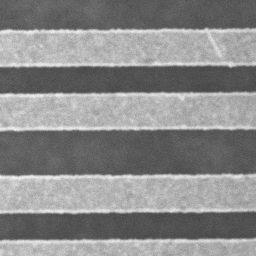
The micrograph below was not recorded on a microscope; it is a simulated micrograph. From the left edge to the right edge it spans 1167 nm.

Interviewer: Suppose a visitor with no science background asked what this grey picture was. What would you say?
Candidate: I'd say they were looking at lines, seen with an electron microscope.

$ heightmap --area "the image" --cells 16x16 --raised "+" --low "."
................
................
++++++++++++++++
++++++++++++++++
................
................
++++++++++++++++
++++++++++++++++
................
................
................
++++++++++++++++
++++++++++++++++
................
................
++++++++++++++++